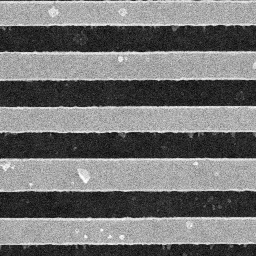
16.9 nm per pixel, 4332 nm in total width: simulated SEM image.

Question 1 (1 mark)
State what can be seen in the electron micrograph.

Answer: lines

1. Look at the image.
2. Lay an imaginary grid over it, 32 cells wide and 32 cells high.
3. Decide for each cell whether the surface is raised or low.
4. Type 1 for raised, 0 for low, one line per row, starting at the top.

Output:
11111111111111111111111111111111
11111111111111111111111111111111
11111111111111111111111111111111
00000000000000000000000000000000
00000000000000000000000000000000
00000000000000000000000000000000
10001100110000001011111111111111
11111111111111111111111111111111
11111111111111111111111111111111
11111111111111111111111111111111
00000000000000000000000000000000
00000000000000000000000000000000
00000000000000000000000000000000
11111111111111111111111111111111
11111111111111111111111111111111
11111111111111111111111111111111
11111111111111110111111110001000
00000000000000000000000000000000
00000000000000000000000000000000
00000000000000000000000000000000
11111111111111111111111111111111
11111111111111111111111111111111
11111111111111111111111111111111
11111111111111111111111111111111
00000000000000000000000000000000
00000000000000000000000000000000
00000000000000000000000000000000
11111111111111111111111111111111
11111111111111111111111111111111
11111111111111111111111111111111
11111111111111111111111011100110
00000000000000000000000000000000